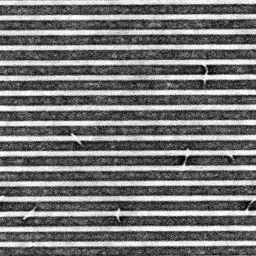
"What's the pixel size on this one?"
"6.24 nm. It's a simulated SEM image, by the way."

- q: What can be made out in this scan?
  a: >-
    parallel lines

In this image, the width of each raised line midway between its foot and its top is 0.0265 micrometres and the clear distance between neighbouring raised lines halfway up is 0.0639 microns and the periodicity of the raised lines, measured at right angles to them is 94.3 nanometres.